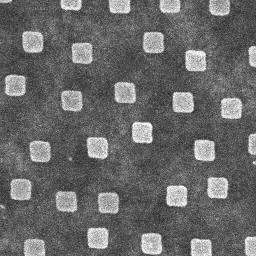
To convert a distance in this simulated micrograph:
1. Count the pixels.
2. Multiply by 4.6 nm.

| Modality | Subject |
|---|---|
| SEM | a regular array of raised bodies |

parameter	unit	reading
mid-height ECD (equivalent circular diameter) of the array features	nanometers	101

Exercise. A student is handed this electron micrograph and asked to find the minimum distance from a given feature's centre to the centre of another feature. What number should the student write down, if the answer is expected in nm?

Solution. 193